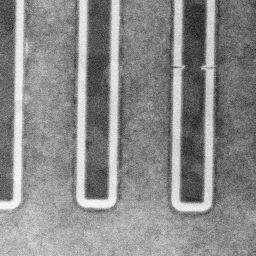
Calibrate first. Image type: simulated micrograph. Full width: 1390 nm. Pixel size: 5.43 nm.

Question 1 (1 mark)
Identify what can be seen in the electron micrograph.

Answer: one or a few lines or trenches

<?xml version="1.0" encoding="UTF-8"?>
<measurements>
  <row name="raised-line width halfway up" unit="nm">179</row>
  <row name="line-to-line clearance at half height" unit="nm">339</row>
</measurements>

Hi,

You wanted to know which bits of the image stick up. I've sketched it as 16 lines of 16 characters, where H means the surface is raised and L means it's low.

HLLLLHHLLLLHHLLL
HLLLLHHLLLLHHLLL
HLLLLHHLLLLHHLLL
HLLLLHHLLLLHHLLL
HLLLLHHLLLLHHLLL
HLLLLHHLLLLHHLLL
HLLLLHHLLLLHHLLL
HLLLLHHLLLLHHLLL
HLLLLHHLLLLHHLLL
HLLLLHHLLLLHHLLL
HLLLLHHLLLLHHLLL
HLLLLHHLLLLHHLLL
HLLLLHHLLLLHHLLL
LLLLLLLLLLLLLLLL
LLLLLLLLLLLLLLLL
LLLLLLLLLLLLLLLL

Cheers